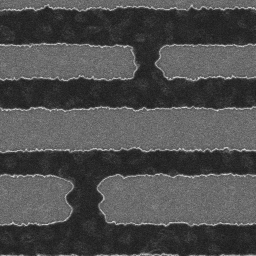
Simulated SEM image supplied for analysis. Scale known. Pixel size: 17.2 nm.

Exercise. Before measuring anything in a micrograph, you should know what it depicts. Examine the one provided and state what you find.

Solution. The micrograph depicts one or a few lines or trenches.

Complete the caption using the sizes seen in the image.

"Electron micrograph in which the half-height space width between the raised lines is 691 nm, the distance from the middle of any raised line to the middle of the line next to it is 68.3 pixels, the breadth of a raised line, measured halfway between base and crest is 540 nanometers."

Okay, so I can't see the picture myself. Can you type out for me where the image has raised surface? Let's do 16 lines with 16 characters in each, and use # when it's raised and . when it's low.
..##...##...#.##
################
################
........##......
........##......
################
################
................
................
################
################
....##..........
....##..........
....###.........
################
################